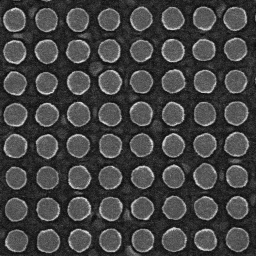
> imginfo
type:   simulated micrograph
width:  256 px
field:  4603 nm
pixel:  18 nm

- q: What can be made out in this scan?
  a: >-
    a regular array of raised bodies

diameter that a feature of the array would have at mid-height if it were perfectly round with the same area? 408 nm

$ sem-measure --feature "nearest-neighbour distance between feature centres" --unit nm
561